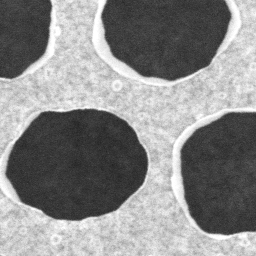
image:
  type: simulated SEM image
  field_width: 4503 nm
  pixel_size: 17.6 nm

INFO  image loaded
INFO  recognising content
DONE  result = holes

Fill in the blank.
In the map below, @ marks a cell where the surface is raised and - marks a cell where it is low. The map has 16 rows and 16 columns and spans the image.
---@@@--------@@
---@@@---------@
---@@@--------@@
---@@@@-------@@
--@@@@@@----@@@@
@@@@@@@@@@@@@@@@
@@@@@@@@@@@@@@@@
@@------@@@@@---
@--------@@@----
---------@@-----
---------@@-----
---------@@-----
@-------@@@-----
@@@---@@@@@@----
@@@@@@@@@@@@@---
@@@@@@@@@@@@@@@@